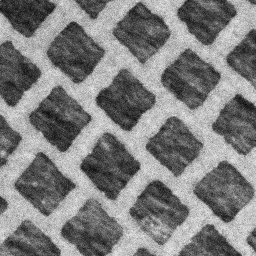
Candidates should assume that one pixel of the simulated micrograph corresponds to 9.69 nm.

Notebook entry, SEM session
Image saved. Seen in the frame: a regular array of holes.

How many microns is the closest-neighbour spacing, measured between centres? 0.651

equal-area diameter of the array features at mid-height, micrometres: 0.516